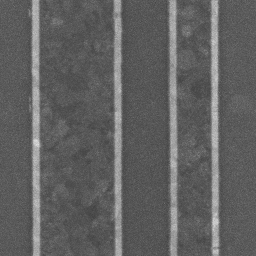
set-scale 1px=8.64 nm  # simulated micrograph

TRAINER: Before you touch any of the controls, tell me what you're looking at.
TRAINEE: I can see one or a few lines or trenches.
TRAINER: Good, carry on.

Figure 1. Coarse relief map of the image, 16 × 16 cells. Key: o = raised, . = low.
..ooooo....oo...
..ooooo....oo...
..ooooo....oo...
..ooooo....oo...
..ooooo....oo...
..ooooo....oo...
..ooooo....oo...
..ooooo....oo...
..ooooo....oo...
..ooooo....oo...
..ooooo....oo...
..ooooo....oo...
..ooooo....oo...
..ooooo....oo...
..ooooo....oo...
..ooooo....oo...